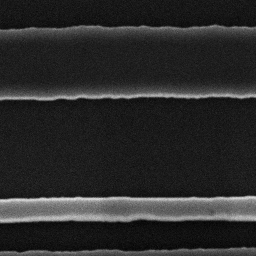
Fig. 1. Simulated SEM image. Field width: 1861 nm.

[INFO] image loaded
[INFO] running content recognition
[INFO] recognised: lines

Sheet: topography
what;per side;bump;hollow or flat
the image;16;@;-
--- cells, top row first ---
----------------
----------------
@@@@@@@@@@@@@@@@
@@@@@@@@@@@@@@@@
@@@@@@@@@@@@@@@@
@@@@@@@@@@@@@@@@
----------------
----------------
----------------
----------------
----------------
----------------
@@@@@@@@@@@@@@@@
@@@@@@@@@@@@@@@@
----------------
---------------@